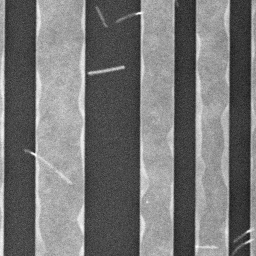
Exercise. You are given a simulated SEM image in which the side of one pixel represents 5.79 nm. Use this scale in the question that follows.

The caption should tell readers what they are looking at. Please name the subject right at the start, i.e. groups of lines, slits or small figures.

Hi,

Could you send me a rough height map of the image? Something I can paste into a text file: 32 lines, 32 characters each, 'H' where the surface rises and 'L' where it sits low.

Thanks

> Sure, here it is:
HLLLLHHHHHHLLLLLLLHHHHLLLHHHHLLL
HLLLLHHHHHHLLLLLLLHHHHLLLHHHLLLL
HLLLLHHHHHLLLLLLLLHHHHLLLHHHLLLL
HLLLLHHHHHHLLLLLLLHHHHLLLHHHLLLL
HLLLLHHHHHHLLLLLLLHHHHLLLHHHHLLL
HLLLLHHHHHHLLLLLLLHHHHLLLHHHHLLL
HLLLLHHHHHLLLLLLLLHHHHLLLHHHHLLL
LLLLLHHHHHLLLLLLLLHHHHLLLHHHHLLL
LLLLLHHHHHLLLLLLLLHHHHLLLHHHHLLL
LLLLLHHHHHLLLLLLLLHHHHLLLHHHLLLL
LLLLLHHHHHLLLLLLLLHHHHLLLHHHHLLH
LLLLLHHHHHLLLLLLLLHHHHLLLHHHHLLH
LLLLLHHHHHLLLLLLLLHHHHLLLHHHHLLL
LLLLLHHHHHLLLLLLLLHHHHLLLHHHLLLL
LLLLLHHHHHLLLLLLLLHHHHLLLHHHLLLL
LLLLLHHHHHHLLLLLLLHHHHLLLHHHLLLL
LLLLLHHHHHLLLLLLLLHHHHLLLHHHLLLH
LLLLLHHHHHLLLLLLLLHHHLLLLHHHLLLH
LLLLLHHHHHLLLLLLLLHHHHLLLHHHLLLH
LLLLHHHHHHLLLLLLLLHHHHLLLHHHLLLH
LLLLLHHHHHLLLLLLLLHHHHLLLHHHLLLH
LLLLLHHHHHLLLLLLLLHHHHLLLHHHLLLH
LLLLLHHHHHLLLLLLLLHHHHLLLHHHLLLH
LLLLLHHHHHLLLLLLLLHHHHLLLHHHHLLH
LLLLLHHHHHLLLLLLLLHHHLLLLHHHHLLH
LLLLLHHHHHLLLLLLLLHHHLLLLHHHHLLH
LLLLLHHHHHLLLLLLLLHHHLLLLHHHHLLH
LLLLLHHHHHLLLLLLLLHHHHLLLHHHLLLH
LLLLLHHHHHLLLLLLLLHHHHLLLHHHLLLH
LLLLLHHHHHLLLLLLLLHHHHLLLHHHLLLH
LLLLLHHHHHLLLLLLLLHHHHLLLHHHLLLH
LLLLLHHHHHLLLLLLLLHHHHLLHHHHLLLH